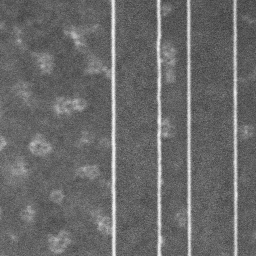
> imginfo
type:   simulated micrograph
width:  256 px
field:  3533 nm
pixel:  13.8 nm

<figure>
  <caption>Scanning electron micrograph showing one or a few lines or trenches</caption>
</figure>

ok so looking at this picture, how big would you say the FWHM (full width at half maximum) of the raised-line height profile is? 0.638 um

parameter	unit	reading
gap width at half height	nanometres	409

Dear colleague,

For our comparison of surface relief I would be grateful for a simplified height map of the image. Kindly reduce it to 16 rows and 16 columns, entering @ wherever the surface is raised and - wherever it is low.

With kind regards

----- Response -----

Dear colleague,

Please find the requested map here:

-------@@@--@@@-
-------@@@--@@@-
-------@@@--@@@-
-------@@@--@@@-
-------@@@--@@@-
-------@@@--@@@-
-------@@@--@@@-
-------@@@--@@@-
-------@@@--@@@-
-------@@@--@@@-
-------@@@--@@@-
-------@@@--@@@-
-------@@@--@@@-
-------@@@--@@@-
-------@@@--@@@-
-------@@@--@@@-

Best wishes